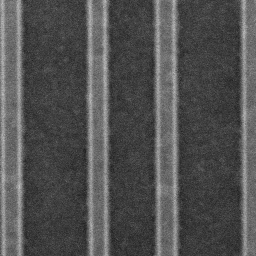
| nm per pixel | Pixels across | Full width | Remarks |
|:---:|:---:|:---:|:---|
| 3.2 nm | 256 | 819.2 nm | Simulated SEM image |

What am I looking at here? one or a few lines or trenches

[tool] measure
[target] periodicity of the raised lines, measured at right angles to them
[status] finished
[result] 77.7 pixels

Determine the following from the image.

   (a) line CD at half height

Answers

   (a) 16.6 px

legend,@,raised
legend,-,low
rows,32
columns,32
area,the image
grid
@@---------@@-------@@--------@@
@@---------@@-------@@--------@@
@@---------@@-------@@---------@
@@---------@@-------@@---------@
@@---------@@-------@@---------@
@@---------@@-------@@---------@
@@---------@@-------@@---------@
@@---------@@-------@@---------@
@@---------@@-------@@---------@
@@---------@@-------@@---------@
@@---------@@-------@@---------@
@@---------@@-------@@---------@
@@---------@@-------@@---------@
@@---------@@-------@@---------@
@@---------@@-------@@---------@
@@---------@@-------@@---------@
@@---------@@-------@@---------@
@@---------@@-------@@---------@
@@---------@@-------@@---------@
@@---------@@-------@@---------@
@@---------@@-------@@---------@
@@---------@@-------@@---------@
@@---------@@-------@@---------@
@@---------@@-------@@---------@
@@---------@@-------@@---------@
@@---------@@-------@@---------@
@@---------@@-------@@---------@
@@---------@@-------@@---------@
@@---------@@-------@@---------@
@@---------@@-------@@---------@
-@---------@@-------@@---------@
-@---------@@-------@@---------@